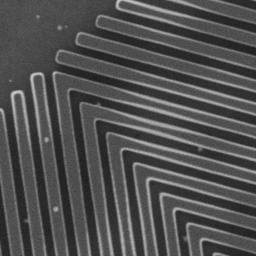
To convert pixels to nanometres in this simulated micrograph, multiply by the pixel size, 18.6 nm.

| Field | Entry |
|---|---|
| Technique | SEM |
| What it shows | groups of lines, slits or small figures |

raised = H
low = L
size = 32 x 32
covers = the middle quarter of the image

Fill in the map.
LLHHHHHHHHHHHHLLLLLLLLLLHHHHHHHH
LLLLLHHHHHHHHHHHHHLLLLLLLLLHHHHH
LLLLLLLLLHHHHHHHHHHHHLLLLLLLLLLH
HHHHLLLLLLLLHHHHHHHHHHHHLLLLLLLL
HHHHHHHLLLLLLLLLLHHHHHHHHHHHLLLL
HHHHHHHHHHHLLLLLLLLLLHHHHHHHHHHL
HLLHHHHHHHHHHHHLLLLLLLLLLLHHHHHH
HLLLLLLHHHHHHHHHHHLLLLLLLLLLLHHH
HLLLLLLLLLHHHHHHHHHHHLLLLLLLLLLL
HLLLLLLLLLLLLLLHHHHHHHHHHLLLLLLL
HLLLHHHHHLLLLLLLLLLHHHHHHHHHHLLL
HHLLHHHHHHHHLLLLLLLLLLLHHHHHHHHH
HHLLHHHHHHHHHHHLLLLLLLLLLLHHHHHH
HHLLHHHHHHHHHHHHHHLLLLLLLLLLLLHH
HHLLLHHHLLLHHHHHHHHHHLLLLLLLLLLL
HHLLLHHHLLLLLLLLHHHHHHHHHLLLLLLL
HHLLLHHHLLLLLLLLLLLLLHHHHHHHHLLL
HHLLLHHHLLLHHLLLLLLLLLLLHHHHHHHH
HHHLLHHHLLLHHHHHLLLLLLLLLLLLHHHH
HHHLLHHHLLLHHHHHHHHLLLLLLLLLLLLH
HHHLLHHHHLLHHHHHHHHHHHHLLLLLLLLL
HHHLLLHHHLLHHHHLLHHHHHHHHHHLLLLL
HHHLLLHHHLLHHHLLLLLLLHHHHHHHHHHL
HHHLLLHHHLLHHHLLLLLLLLLLHHHHHHHH
HHHLLLHHHLLHHHHLLLLLLLLLLLLLHHHH
HHHHLLHHHLLLHHHLLLHHLLLLLLLLLLLH
HHHHLLHHHLLLHHHLLLHHHHHHLLLLLLLL
LHHHLLHHHLLLHHHLLLHHHHHHHHHHHLLL
LHHHLLHHHLLLHHHLLLHHHHHHHHHHHHHH
LHHHLLLHHHLLHHHLLLHHHLLLLLHHHHHH
LHHHLLLHHHLLHHHLLLHHHLLLLLLLLHHH
LHHHLLLHHHLLLHHHLLHHHLLLLLLLLLLL